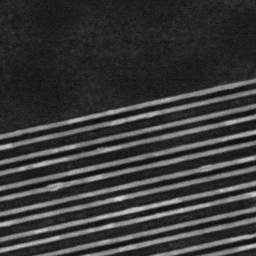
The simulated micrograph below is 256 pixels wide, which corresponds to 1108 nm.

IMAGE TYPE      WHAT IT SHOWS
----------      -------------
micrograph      parallel lines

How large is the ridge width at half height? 20.1 nm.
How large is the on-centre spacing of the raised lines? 53.7 nm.